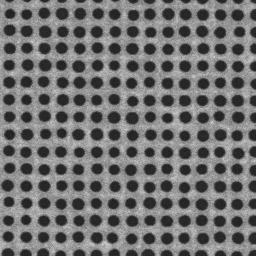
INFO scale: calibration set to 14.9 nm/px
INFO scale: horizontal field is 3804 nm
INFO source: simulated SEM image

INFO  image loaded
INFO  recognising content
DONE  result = a regular array of holes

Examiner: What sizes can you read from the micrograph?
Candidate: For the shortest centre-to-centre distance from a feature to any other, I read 248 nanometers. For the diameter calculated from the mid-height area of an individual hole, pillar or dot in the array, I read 179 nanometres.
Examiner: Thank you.